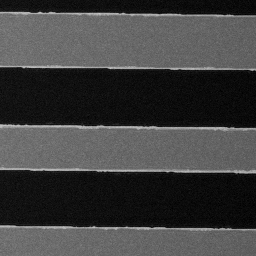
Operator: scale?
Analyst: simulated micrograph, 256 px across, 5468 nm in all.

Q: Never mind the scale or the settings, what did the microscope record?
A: lines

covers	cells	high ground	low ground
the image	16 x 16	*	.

................
****************
****************
****************
................
................
................
................
****************
****************
****************
................
................
................
****************
****************